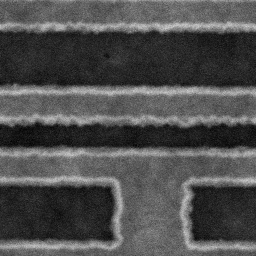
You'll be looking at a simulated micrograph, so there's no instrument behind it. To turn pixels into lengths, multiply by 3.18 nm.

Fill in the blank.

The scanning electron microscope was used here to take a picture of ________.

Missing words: one or a few lines or trenches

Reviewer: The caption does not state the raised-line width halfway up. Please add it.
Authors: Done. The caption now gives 85.3 nanometers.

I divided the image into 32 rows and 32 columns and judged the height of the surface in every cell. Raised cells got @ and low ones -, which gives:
@@@@@@@@@@@@@@@@@@@@@@@@@@@@@@@@
@@@@@@@@@@@@@@@@@@@@@@@@@@@@@@@@
@@@@@@@@@@@@@@@@@@@@@@@@@@@@@@@@
--------------------------------
--------------------------------
--------------------------------
--------------------------------
--------------------------------
--------------------------------
--------------------------------
--------------------------------
@--@@@@--@@@-----@----@@@-------
@@@@@@@@@@@@@@@@@@@@@@@@@@@@@@@@
@@@@@@@@@@@@@@@@@@@@@@@@@@@@@@@@
@@@@@@@@@@@@@@@@@@@@@@@@@@@@@@@@
-----------------------@--------
--------------------------------
--------------------------------
--------------------------------
@@@@@@@@@@@@@@@@@@@@@@@@@@@@@@@@
@@@@@@@@@@@@@@@@@@@@@@@@@@@@@@@@
@@@@@@@@@@@@@@@@@@@@@@@@@@@@@@@@
-----------@@@@@@@@@@@@@@----@@@
---------------@@@@@@@@---------
---------------@@@@@@@@---------
---------------@@@@@@@@---------
---------------@@@@@@@@---------
---------------@@@@@@@@---------
---------------@@@@@@@@---------
---------------@@@@@@@@---------
---------------@@@@@@@@@--------
@@@@@@@@@@@@@@@@@@@@@@@@@@@@@@@@